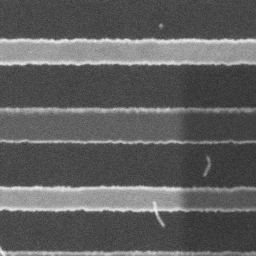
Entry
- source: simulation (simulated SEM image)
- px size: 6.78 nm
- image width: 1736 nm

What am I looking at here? lines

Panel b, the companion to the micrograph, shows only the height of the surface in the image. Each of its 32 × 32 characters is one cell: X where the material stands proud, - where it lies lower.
--------------------------------
--------------------------------
--------------------------------
--------------------------------
--------------------------------
XXXXXXXXXXXXXXXXXXXXXXXXXXXXXXXX
XXXXXXXXXXXXXXXXXXXXXXXXXXXXXXXX
XXXXXXXXXXXXXXXXXXXXXXXXXXXXXXXX
--------------------------------
--------------------------------
--------------------------------
--------------------------------
--------------------------------
--------------------------------
XXXXXXXXXXXXXXXXXXXXXXXXXXXXXXXX
XXXXXXXXXXXXXXXXXXXXXXXXXXXXXXXX
XXXXXXXXXXXXXXXXXXXXXXXXXXXXXXXX
XXXXXXXXXXXXXXXXXXXXXXXXXXXXXXXX
--------------------------------
--------------------------------
--------------------------------
--------------------------------
--------------------------------
XXXXXX-----XXXXXXXX-----------XX
XXXXXXXXXXXXXXXXXXXXXXXXXXXXXXXX
XXXXXXXXXXXXXXXXXXXXXXXXXXXXXXXX
--------------------------------
--------------------------------
--------------------------------
--------------------------------
--------------------------------
X-------------------------------